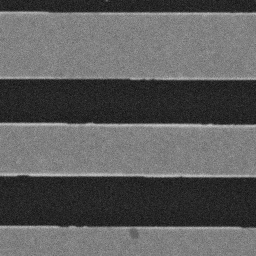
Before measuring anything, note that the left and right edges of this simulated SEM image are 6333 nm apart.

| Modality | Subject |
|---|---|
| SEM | lines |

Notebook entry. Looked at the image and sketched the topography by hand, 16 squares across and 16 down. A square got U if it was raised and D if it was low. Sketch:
DDDDDDDDDDDDDDDD
UUUUUUUUUUUUUUUU
UUUUUUUUUUUUUUUU
UUUUUUUUUUUUUUUU
UUUUUUUUUUUUUUUU
DDDDDDDDDDDDDDDD
DDDDDDDDDDDDDDDD
DDDDDDDDDDDDDDDD
UUUUUUUUUUUUUUUU
UUUUUUUUUUUUUUUU
UUUUUUUUUUUUUUUU
DDDDDDDDDDDDDDDD
DDDDDDDDDDDDDDDD
DDDDDDDDDDDDDDDD
UUUUUUUUUUUUUUUU
UUUUUUUUUUUUUUUU